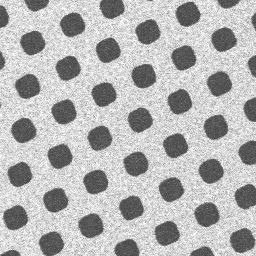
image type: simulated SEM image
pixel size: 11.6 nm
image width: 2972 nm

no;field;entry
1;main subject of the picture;a regular array of holes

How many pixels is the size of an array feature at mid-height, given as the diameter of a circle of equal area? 24.6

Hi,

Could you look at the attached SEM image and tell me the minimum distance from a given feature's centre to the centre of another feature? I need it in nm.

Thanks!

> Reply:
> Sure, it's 507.